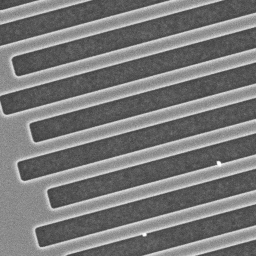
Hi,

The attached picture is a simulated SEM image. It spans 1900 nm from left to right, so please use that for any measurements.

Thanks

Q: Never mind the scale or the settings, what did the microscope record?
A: groups of lines, slits or small figures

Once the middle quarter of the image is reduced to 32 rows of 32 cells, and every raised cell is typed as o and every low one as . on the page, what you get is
ooooooooooo....................o
ooooooo....................ooooo
oooo....................oooooooo
....................oooooooooooo
................ooooooooooooo...
.............ooooooooooooo......
.........ooooooooooooo..........
.....ooooooooooooo..............
..ooooooooooooo.................
ooooooooooo....................o
ooooooo....................ooooo
oooo....................oooooooo
....................oooooooooooo
................ooooooooooooo...
.............ooooooooooooo......
.........ooooooooooooo..........
.....ooooooooooooo..............
..oooooooooooo..................
oooooooooo....................oo
oooooo....................oooooo
ooo....................ooooooooo
...................ooooooooooooo
...............ooooooooooooo....
............ooooooooooooo.......
........ooooooooooooo...........
....ooooooooooooo...............
.ooooooooooooo..................
oooooooooo....................oo
oooooo....................oooooo
ooo....................ooooooooo
...................ooooooooooooo
...............ooooooooooooo....